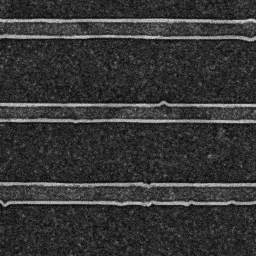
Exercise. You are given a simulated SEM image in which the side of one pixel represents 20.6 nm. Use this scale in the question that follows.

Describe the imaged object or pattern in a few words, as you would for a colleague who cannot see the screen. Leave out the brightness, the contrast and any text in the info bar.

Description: one or a few lines or trenches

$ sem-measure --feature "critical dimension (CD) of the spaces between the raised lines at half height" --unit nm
1320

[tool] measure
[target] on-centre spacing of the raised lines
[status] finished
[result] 1.7 um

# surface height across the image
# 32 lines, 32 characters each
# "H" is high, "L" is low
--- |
LLLLLLLLLLLLLLLLLLLLLLLLLLLLLLLL
LLLLLLLLLLLLLLLLLLLLLLLLLLLLLLLL
LLLLLLLLLLLLLLLLLLLLLLLLLLLLLLLL
HHHHHHHHHHHHHHHHHHHHHHHHHHHHHHHH
HHHHHHHHHHHHHHHHHHHHHHHHHHHHHHHH
LLLLLLLLLLLLLLLLLLLLLLLLLLLLLLLL
LLLLLLLLLLLLLLLLLLLLLLLLLLLLLLLL
LLLLLLLLLLLLLLLLLLLLLLLLLLLLLLLL
LLLLLLLLLLLLLLLLLLLLLLLLLLLLLLLL
LLLLLLLLLLLLLLLLLLLLLLLLLLLLLLLL
LLLLLLLLLLLLLLLLLLLLLLLLLLLLLLLL
LLLLLLLLLLLLLLLLLLLLLLLLLLLLLLLL
LLLLLLLLLLLLLLLLLLLLLLLLLLLLLLLL
HHHHHHHHHHHHHHHHHHHHHHHHHHHHHHHH
HHHHHHHHHHHHHHHHHHHHHHHHHHHHHHHH
LLLLLLLLLLLLLLLLLLLLLLLLLLLLLLLL
LLLLLLLLLLLLLLLLLLLLLLLLLLLLLLLL
LLLLLLLLLLLLLLLLLLLLLLLLLLLLLLLL
LLLLLLLLLLLLLLLLLLLLLLLLLLLLLLLL
LLLLLLLLLLLLLLLLLLLLLLLLLLLLLLLL
LLLLLLLLLLLLLLLLLLLLLLLLLLLLLLLL
LLLLLLLLLLLLLLLLLLLLLLLLLLLLLLLL
LLLLLLLLLLLLLLLLLLLLLLLLLLLLLLLL
HHHHHHHHHHHHHHHHHHHHHHHHHHHHHHHH
HHHHHHHHHHHHHHHHHHHHHHHHHHHHHHHH
HLLLLLLLLLLLLLLLLHHLLLLHLLLLLLLL
LLLLLLLLLLLLLLLLLLLLLLLLLLLLLLLL
LLLLLLLLLLLLLLLLLLLLLLLLLLLLLLLL
LLLLLLLLLLLLLLLLLLLLLLLLLLLLLLLL
LLLLLLLLLLLLLLLLLLLLLLLLLLLLLLLL
LLLLLLLLLLLLLLLLLLLLLLLLLLLLLLLL
LLLLLLLLLLLLLLLLLLLLLLLLLLLLLLLL